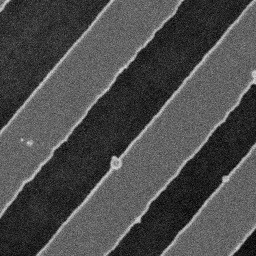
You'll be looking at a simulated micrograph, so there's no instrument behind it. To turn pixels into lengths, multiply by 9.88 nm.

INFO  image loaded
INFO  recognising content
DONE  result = lines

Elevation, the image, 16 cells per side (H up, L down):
LLLLLLLHHHHLLLLH
LLLLLLHHHHLLLLLH
LLLLLHHHHLLLLLHH
LLLLHHHHHLLLLHHH
LLLHHHHHLLLLHHHH
LLHHHHHLLLLHHHHH
LHHHHHLLLLHHHHHL
LHHHHLLLLHHHHHLL
HHHHLLLLLHHHHLLL
HHHLLLLLHHHHLLLL
HHHLLLLHHHHLLLLH
HHLLLLHHHHHLLLHH
HLLLLHHHHHLLLHHH
LLLLHHHHHLLLHHHH
LLLLHHHHLLLHHHHH
LLLHHHHLLLHHHHHL